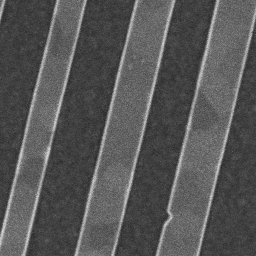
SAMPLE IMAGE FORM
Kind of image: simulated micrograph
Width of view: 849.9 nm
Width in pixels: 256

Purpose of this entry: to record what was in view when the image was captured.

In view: one or a few lines or trenches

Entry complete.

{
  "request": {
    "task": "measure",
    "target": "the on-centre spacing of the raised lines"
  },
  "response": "0.27 um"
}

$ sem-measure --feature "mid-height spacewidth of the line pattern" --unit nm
162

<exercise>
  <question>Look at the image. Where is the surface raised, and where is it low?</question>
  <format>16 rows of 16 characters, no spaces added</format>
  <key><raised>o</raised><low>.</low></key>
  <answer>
...oo...ooo...oo
...oo...oo...ooo
...oo...oo...ooo
...oo...oo...oo.
...o...ooo...oo.
..oo...ooo..ooo.
..oo...oo...ooo.
..oo...oo...oo..
..o....oo...oo..
.oo...ooo..ooo..
.oo...oo...ooo..
.oo...oo...oo...
.o....oo...oo...
oo...ooo...oo...
oo...oo...ooo...
oo...oo...oo....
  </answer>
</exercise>